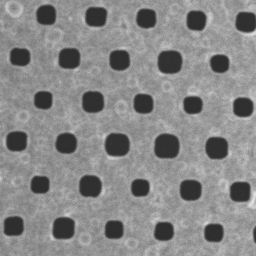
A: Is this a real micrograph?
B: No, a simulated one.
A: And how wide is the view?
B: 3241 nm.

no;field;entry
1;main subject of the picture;a regular array of holes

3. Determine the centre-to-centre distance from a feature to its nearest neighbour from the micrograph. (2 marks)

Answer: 620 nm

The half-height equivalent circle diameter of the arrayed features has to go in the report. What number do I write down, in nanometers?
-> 272